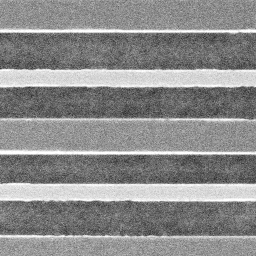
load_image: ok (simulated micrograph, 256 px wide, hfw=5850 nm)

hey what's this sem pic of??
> lines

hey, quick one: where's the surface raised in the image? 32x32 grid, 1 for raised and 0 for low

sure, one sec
11111111111111111111111111111111
11111111111111111111111111111111
11111111111111111111111111111111
11111111111111111111111111111111
00000000000000000000000000000000
00000000000000000000000000000000
00000000000000000000000000000000
00000000000000000000000000000000
00000000000000000000000000000000
11111111111111111111111111111111
11111111111111111111111111111111
00000000000000000000000000000000
00000000000000000000000000000000
00000000000000000000000000000000
00000000000000000000000000000000
11111111111111111111111111111111
11111111111111111111111111111111
11111111111111111111111111111111
11111111111111111111111111111111
00000000000000000000000000000000
00000000000000000000000000000000
00000000000000000000000000000000
00000000000000000000000000000000
11111111111111111111111111111111
11111111111111111111111111111111
00000000000000000000000000000000
00000000000000000000000000000000
00000000000000000000000000000000
00000000000000000000000000000000
00000000000000000000000000000000
11111111111111111111111111111111
11111111111111111111111111111111